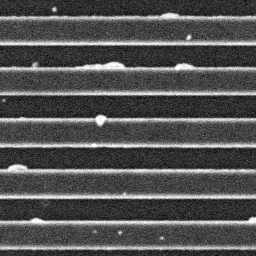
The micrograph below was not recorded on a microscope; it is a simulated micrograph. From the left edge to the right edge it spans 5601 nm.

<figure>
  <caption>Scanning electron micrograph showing lines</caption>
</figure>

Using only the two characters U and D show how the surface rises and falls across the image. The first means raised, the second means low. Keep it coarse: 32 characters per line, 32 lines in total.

DDDDDDDDDDDDDDDDDDDDDDDDDDDDDDDD
DDDDDDDDDDDDDDDDDDDDDDDDDDDDDDDD
UUUUUUUUUUUUUUUUUUUUUUUUUUUUUUUU
UUUUUUUUUUUUUUUUUUUUUUUUUUUUUUUU
UUUUUUUUUUUUUUUUUUUUUUUUUUUUUUUU
DDDDUUUDDDDDDUDDDDDUUUUUUUUUUUUU
DDDDDDDDDDDDDDDDDDDDDDDDDDDDDDDD
DDDDDDDDDDDDDDDDDDDDDDDDDDDDDDDD
DDDDDDDDDDDDDDDDDDDDDDUDDDDDDDDD
UUUUUUUUUUUUUUUUUUUUUUUUUUUUUUUU
UUUUUUUUUUUUUUUUUUUUUUUUUUUUUUUU
UUUUUUUUUUUUUUUUUUUUUUUUUUUUUUUU
DDDDDDDDDDDDDDDDDDDDDDDDDDDDDDDD
DDDDDDDDDDDDDDDDDDDDDDDDDDDDDDDD
DDDDDDDDDDDDUDDDDDDDDDDDDDDDDDDD
UUUUUUUUUUUUUUUUUUUUUUUUUUUUUUUU
UUUUUUUUUUUUUUUUUUUUUUUUUUUUUUUU
UUUUUUUUUUUUUUUUUUUUUUUUUUUUUUUU
DDDDDDDDDDDDDDDDDDDDDDDDDDDDDDDD
DDDDDDDDDDDDDDDDDDDDDDDDDDDDDDDD
DDDDDDDDDDDDDDDDDDDDDDDDDDDDDDDD
UUUUUUUUUUUUUUUUUUUUUUUUUUUUUUUU
UUUUUUUUUUUUUUUUUUUUUUUUUUUUUUUU
UUUUUUUUUUUUUUUUUUUUUUUUUUUUUUUU
UUUUUUUUUUUUUUUUUUUUUUUUUUUUUUUU
DDDDDDDDDDDDDDDDDDDDDDDDDDDDDDDD
DDDDDDDDDDDDDDDDDDDDDDDDDDDDDDDD
DDDDDDDDDDDDDDDDDDDDDDDDDDDDDDDD
UUUUUUUUUUUUUUUUUUUUUUUUUUUUUUUU
UUUUUUUUUUUUUUUUUUUUUUUUUUUUUUUU
UUUUUUUUUUUUUUUUUUUUUUUUUUUUUUUU
DDDDDDDDDDDDDDDDDDDDDDDDDDDDDDDD